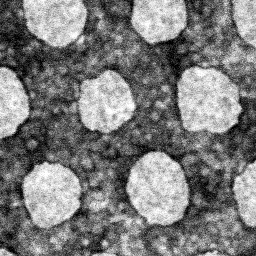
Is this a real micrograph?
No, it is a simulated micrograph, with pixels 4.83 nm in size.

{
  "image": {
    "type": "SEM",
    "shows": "raised bodies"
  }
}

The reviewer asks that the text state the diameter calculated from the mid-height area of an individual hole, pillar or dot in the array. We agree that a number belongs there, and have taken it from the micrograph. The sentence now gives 294 nm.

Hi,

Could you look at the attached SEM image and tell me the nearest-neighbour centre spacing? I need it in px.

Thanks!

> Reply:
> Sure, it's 101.